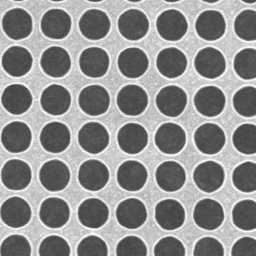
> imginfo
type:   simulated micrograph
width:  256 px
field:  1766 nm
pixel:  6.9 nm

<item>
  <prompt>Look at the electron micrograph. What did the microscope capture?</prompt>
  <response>a regular array of holes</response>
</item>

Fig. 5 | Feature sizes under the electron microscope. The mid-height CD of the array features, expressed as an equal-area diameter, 215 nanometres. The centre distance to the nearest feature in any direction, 259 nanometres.